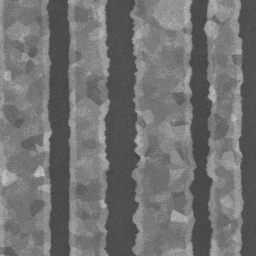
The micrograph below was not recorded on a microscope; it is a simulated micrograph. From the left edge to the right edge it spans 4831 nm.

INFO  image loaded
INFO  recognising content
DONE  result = one or a few lines or trenches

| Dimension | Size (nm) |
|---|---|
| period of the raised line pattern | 1280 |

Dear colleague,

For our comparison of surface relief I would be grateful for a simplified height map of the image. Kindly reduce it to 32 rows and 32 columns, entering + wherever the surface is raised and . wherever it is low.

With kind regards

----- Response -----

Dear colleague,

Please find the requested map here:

++++++...++++....++++++....+++..
++++++...++++....++++++...++++..
++++++...++++....++++++...+++...
++++++...++++....+++++++..+++...
++++++...++++....+++++++..++++..
++++++...++++....+++++++..++++..
++++++...++++....++++++...++++..
++++++...++++.....+++++...++++..
++++++...++++.....+++++...++++..
++++++...++++....+++++++..++++..
++++++...++++....++++++....+++..
++++++...++++....++++++...++++..
++++++...++++....++++++....+++..
++++++...++++....+++++++...+++..
++++++...++++....+++++++..++++..
++++++...++++....+++++++...+++..
++++++...++++....+++++++...+++..
++++++...++++....+++++++..++++..
++++++...++++....+++++++..++++..
++++++...++++.....++++++..++++..
++++++...++++.....++++++..++++..
++++++...++++....+++++++..++++..
++++++...++++....+++++++...+++..
++++++...++++.....+++++....+++..
++++++...++++....+++++++..++++..
++++++...++++.....++++++..++++..
++++++...++++....+++++++..++++..
++++++...++++....+++++++...+++..
++++++...++++....+++++++...+++..
++++++...++++....+++++++...+++..
++++++...++++....+++++++...+++..
++++++...++++....+++++++...+++..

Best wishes